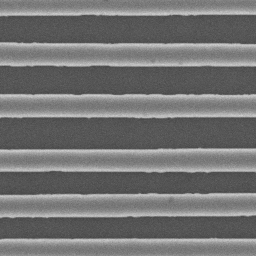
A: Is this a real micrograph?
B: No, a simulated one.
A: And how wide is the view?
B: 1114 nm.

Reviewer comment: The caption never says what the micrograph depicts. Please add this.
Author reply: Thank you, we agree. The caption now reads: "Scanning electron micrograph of lines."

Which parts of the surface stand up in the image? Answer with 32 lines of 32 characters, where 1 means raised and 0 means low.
11111111111111111111111111111111
11111111111111111111111111111111
00000000000000000000000000000000
00000000000000000000000000000000
00000000000000000000000000000000
11111111111110111101111111111000
11111111111111111111111111111111
11111111111111111111111111111111
00000000000000000000000000000000
00000000000000000000000000000000
00000000000000000000000000000000
00000000000000000000000000000000
11111111111111111111111111111111
11111111111111111111111111111111
11111111111111111111111111110111
00000000000000000000000000000000
00000000000000000000000000000000
00000000000000000000000000000000
00000000000000000000000000000000
11111111111111111111111111111111
11111111111111111111111111111111
00000000000000000000000000000000
00000000000000000000000000000000
00000000000000000000000000000000
11111111111111111111111111111111
11111111111111111111111111111111
11111111111111111111111111111111
00000000000000000000000000000000
00000000000000000000000000000000
00000000000000000000000000000000
11111111111111111111111111111111
11111111111111111111111111111111